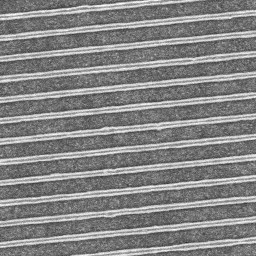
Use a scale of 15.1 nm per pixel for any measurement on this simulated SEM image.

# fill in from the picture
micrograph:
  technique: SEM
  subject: parallel lines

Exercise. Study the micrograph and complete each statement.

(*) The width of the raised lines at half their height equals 67.4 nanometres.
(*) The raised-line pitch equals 310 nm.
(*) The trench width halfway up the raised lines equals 246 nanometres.